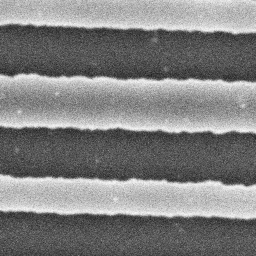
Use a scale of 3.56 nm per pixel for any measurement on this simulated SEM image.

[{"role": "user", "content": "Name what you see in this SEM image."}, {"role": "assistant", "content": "lines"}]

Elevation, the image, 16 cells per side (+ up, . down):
++++++++++++++++
..++++++++++++++
................
................
................
++++++++++++++++
++++++++++++++++
++++++++++++++++
................
................
................
++++++++++++++..
++++++++++++++++
.............+++
................
................